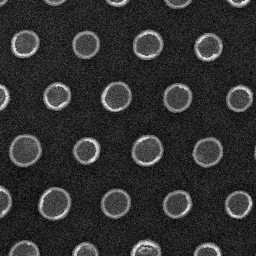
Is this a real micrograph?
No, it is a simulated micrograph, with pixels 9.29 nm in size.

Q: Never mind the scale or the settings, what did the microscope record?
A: a regular array of raised bodies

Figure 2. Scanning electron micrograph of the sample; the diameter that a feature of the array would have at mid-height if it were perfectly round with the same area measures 27.3 px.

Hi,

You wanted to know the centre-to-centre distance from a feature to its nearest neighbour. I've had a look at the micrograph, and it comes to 560 nm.